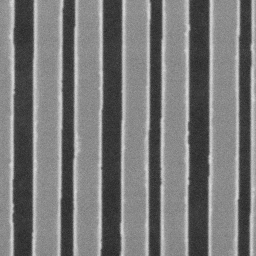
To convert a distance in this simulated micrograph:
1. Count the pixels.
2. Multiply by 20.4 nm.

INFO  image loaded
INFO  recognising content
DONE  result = lines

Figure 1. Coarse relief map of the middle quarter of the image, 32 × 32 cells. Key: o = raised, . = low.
...oooooo......oooooo....oooooo.
...oooooo......oooooo....oooooo.
...oooooo......oooooo....oooooo.
...oooooo......oooooo....oooooo.
...oooooo......oooooo....oooooo.
...oooooo......oooooo....oooooo.
...oooooo......oooooo....oooooo.
...oooooo......oooooo....oooooo.
...oooooo......oooooo....oooooo.
...oooooo......oooooo....oooooo.
...oooooo......oooooo....oooooo.
...oooooo......oooooo....oooooo.
...oooooo......oooooo....oooooo.
...oooooo......oooooo....oooooo.
...oooooo......oooooo....oooooo.
...oooooo......oooooo....oooooo.
...oooooo......oooooo....oooooo.
...oooooo......oooooo....oooooo.
...oooooo......oooooo....oooooo.
...oooooo......oooooo....oooooo.
...oooooo......oooooo....oooooo.
...oooooo......oooooo....oooooo.
...oooooo......oooooo....oooooo.
...oooooo......oooooo....oooooo.
...oooooo......oooooo....oooooo.
...oooooo......oooooo....oooooo.
...oooooo......oooooo....oooooo.
...oooooo......oooooo....oooooo.
...oooooo......oooooo....oooooo.
...oooooo......oooooo....oooooo.
...oooooo......oooooo....oooooo.
...oooooo......oooooo....oooooo.